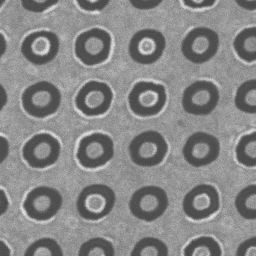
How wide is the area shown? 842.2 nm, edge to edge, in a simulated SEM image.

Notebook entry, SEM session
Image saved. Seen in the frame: a regular array of ring-shaped grooves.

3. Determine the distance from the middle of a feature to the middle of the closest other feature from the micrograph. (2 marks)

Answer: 0.169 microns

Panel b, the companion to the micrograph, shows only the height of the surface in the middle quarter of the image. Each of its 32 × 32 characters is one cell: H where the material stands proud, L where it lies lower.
HHHHHHHHHHHHHHHHHHHHHHHHHHHHHHHH
HHHHHHHHHHHHHHHHHHHHHHHHHHHHHHHH
HHHHHHHHHHHHHHHHHHHHHHHHHHHHHHHH
HHHHHHHHHHHHHHHHHHHHHHHHHHHHHHHH
HHHHHHLLLLHHHHHHHHHLLLHHHHHHHHHH
HHHHHLLLLLLHHHHHHHLLLLLLLHHHHHHL
HHHHLLLLLLLLHHHHHLLLLLLLLHHHHHLL
HHHLLLHHHHLLHHHHLLLHHHHLLHHHHHLL
HHHLLHHHHHLLHHHHLLLHHHHLLLHHHHLL
HHHLLHHHHHLLHHHHLLLHHHHLLHHHHHLL
HHHLLLHHLLLHHHHHLLLLHHLLLHHHHHLL
HHHHLLLLLLLHHHHHHLLLLLLLHHHHHHLL
HHHHHLLLLLHHHHHHHHLLLLLHHHHHHHHL
HHHHHHHHHHHHHHHHHHHHHHHHHHHHHHHH
HHHHHHHHHHHHHHHHHHHHHHHHHHHHHHHH
HHHHHHHHHHHHHHHHHHHHHHHHHHHHHHHH
HHHHHHHHHHHHHHHHHHHHHLHHHHHHHHHH
HHHHHHHLLHHHHHHHHHHLLLLLHHHHHHHH
HHHHHLLLLLLLHHHHHLLLLLLLLHHHHHHL
HHHHLLLLLLLLHHHHHLLLLLLLLLHHHHHL
HHHHLLHHHLLLHHHHLLLHHHHLLLHHHHLL
HHHLLLHHHHLLHHHHLLLHHHHLLLHHHHLL
HHHLLLHHHLLLHHHHLLLHHHHLLLHHHHLL
HHHLLLHLLLLLHHHHHLLLLLLLLHHHHHLL
HHHHLLLLLLLHHHHHHLLLLLLLHHHHHHHL
HHHHHLLLLHHHHHHHHHHLLLHHHHHHHHHH
HHHHHHHHHHHHHHHHHHHHHHHHHHHHHHHH
HHHHHHHHHHHHHHHHHHHHHHHHHHHHHHHH
HHHHHHHHHHHHHHHHHHHHHHHHHHHHHHHH
HHHHHHHHHHHHHHHHHHHHHHHHHHHHHHHH
HHHHHHLLLLLHHHHHHHHHLLLHHHHHHHHH
HHHHHLLLLLLLHHHHHHLLLLLLLHHHHHHH